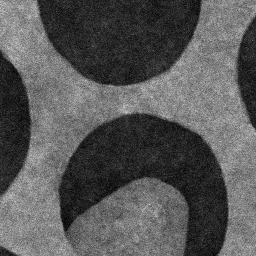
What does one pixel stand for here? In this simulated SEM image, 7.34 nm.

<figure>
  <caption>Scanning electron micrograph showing holes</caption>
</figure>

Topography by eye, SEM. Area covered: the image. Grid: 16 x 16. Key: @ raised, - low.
@@-----------@@@
@@@---------@@@@
@@@---------@@@-
@@@@-------@@@@-
-@@@@-----@@@@@-
--@@@@@@@@@@@@@-
--@@@@@@@@@@@@@-
--@@@@@----@@@@@
--@@@--------@@@
--@@@--------@@@
-@@@----------@@
-@@@----------@@
@@@@----------@@
@@@@----------@@
@@@@----------@@
@@@@----------@@